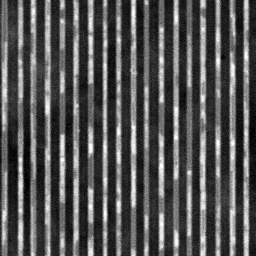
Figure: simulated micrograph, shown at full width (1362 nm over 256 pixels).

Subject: parallel lines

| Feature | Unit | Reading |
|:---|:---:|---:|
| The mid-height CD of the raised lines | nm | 23.3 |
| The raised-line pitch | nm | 75.5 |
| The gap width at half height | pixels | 9.87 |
